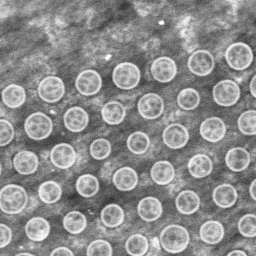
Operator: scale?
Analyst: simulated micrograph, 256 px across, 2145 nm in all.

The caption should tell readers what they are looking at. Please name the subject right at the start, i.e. a regular array of raised bodies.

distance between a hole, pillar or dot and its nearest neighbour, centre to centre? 318 nm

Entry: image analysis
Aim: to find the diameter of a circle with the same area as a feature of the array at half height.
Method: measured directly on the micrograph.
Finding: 186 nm